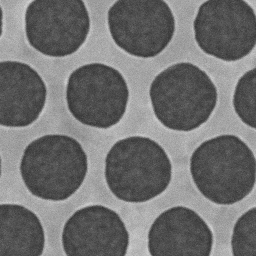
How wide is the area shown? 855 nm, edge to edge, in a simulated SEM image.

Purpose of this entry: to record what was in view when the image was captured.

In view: holes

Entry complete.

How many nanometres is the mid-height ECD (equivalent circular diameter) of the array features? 225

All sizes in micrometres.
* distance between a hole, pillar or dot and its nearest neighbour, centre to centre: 0.28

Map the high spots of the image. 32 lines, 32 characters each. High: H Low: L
HHHHLLLLLLLHHHLLLLLLLHHHHLLLLLLH
HHHLLLLLLLLHHHLLLLLLLHHHHLLLLLLL
HHHLLLLLLLLHHLLLLLLLLLHHLLLLLLLL
HHHLLLLLLLLHHHLLLLLLLLHHLLLLLLLL
HHHLLLLLLLLHHHLLLLLLLLHHLLLLLLLL
HHHHLLLLLLHHHHHLLLLLLHHHHLLLLLLL
HHHHHLLLLHHHHHHHLLLLHHHHHHLLLLLH
HHHHHHHHHHHHHHHHHHHHHHHHHHHHLLHH
LLLLHHHHHHLLLLHHHHHHHLLLLHHHHHHH
LLLLLHHHHLLLLLLHHHHHLLLLLLHHHHLL
LLLLLLHHLLLLLLLLHHHLLLLLLLLHHHLL
LLLLLLHHLLLLLLLLHHHLLLLLLLLHHLLL
LLLLLLHHLLLLLLLLHHHLLLLLLLLHHLLL
LLLLLHHHHLLLLLLLHHHLLLLLLLLHHLLL
LLLLLHHHHLLLLLLHHHHLLLLLLLHHHHLL
LLLLHHHHHHHLLLLHHHHHLLLLLHHHHHHL
HHHHHHHHHHHHHHHHHHHHHHHHHHHHHHHH
HHHHLLLLLLHHHHHLLLLHHHHHHHLLLLHH
HHHLLLLLLLHHHHLLLLLLHHHHHLLLLLLH
HHHLLLLLLLLHHLLLLLLLLHHHLLLLLLLL
HHHLLLLLLLLHHLLLLLLLLHHHLLLLLLLL
HHHLLLLLLLLHHLLLLLLLLLHHLLLLLLLL
HHHLLLLLLLHHHLLLLLLLLHHHLLLLLLLL
HHHLLLLLLLHHHHLLLLLLLHHHHLLLLLLL
HHHHLLLLLHHHHHLLLLLLHHHHHHLLLLLH
HHHHHHHHHHHHHHHHHHHHHHHHHHHLLHHH
LLLLHHHHHLLLLLHHHHHHLLLLHHHHHHHL
LLLLLHHHLLLLLLLHHHHLLLLLLHHHHHLL
LLLLLHHHLLLLLLLLHHHLLLLLLLHHHLLL
LLLLLLHHLLLLLLLLHHHLLLLLLLLHHLLL
LLLLLLHHLLLLLLLLHHLLLLLLLLLHHLLL
LLLLLHHHLLLLLLLLHHHLLLLLLLHHHLLL